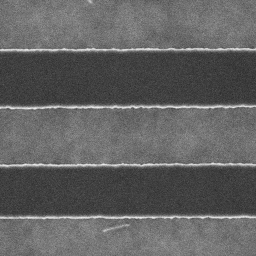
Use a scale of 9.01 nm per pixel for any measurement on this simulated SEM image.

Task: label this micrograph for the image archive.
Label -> lines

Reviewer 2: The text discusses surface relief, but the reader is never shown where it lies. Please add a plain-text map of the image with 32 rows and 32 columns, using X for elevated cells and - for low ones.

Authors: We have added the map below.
--------------------------------
--------------------------------
--------------------------------
--------------------------------
--------------------------------
--------------------------------
XXXXXXXXXXXXXXXXXXXXXXXXXXXXXXXX
XXXXXXXXXXXXXXXXXXXXXXXXXXXXXXXX
XXXXXXXXXXXXXXXXXXXXXXXXXXXXXXXX
XXXXXXXXXXXXXXXXXXXXXXXXXXXXXXXX
XXXXXXXXXXXXXXXXXXXXXXXXXXXXXXXX
XXXXXXXXXXXXXXXXXXXXXXXXXXXXXXXX
XXXXXXXXXXXXXXXXXXXXXXXXXXXXXXXX
-XXXXX--------------------------
--------------------------------
--------------------------------
--------------------------------
--------------------------------
--------------------------------
--------------------------------
--------------------------XX----
XXXXXXXXXXXXXXXXXXXXXXXXXXXXXXXX
XXXXXXXXXXXXXXXXXXXXXXXXXXXXXXXX
XXXXXXXXXXXXXXXXXXXXXXXXXXXXXXXX
XXXXXXXXXXXXXXXXXXXXXXXXXXXXXXXX
XXXXXXXXXXXXXXXXXXXXXXXXXXXXXXXX
XXXXXXXXXXXXXXXXXXXXXXXXXXXXXXXX
--------------------------------
--------------------------------
--------------------------------
--------------------------------
--------------------------------